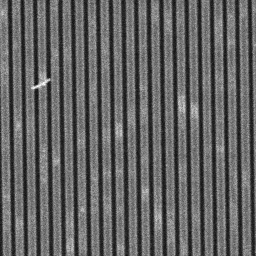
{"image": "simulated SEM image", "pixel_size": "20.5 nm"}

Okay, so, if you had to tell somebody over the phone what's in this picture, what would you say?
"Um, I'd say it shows parallel lines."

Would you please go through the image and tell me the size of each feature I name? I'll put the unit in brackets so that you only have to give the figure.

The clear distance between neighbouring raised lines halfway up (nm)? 92.2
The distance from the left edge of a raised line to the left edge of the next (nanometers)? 258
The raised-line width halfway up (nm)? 166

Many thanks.